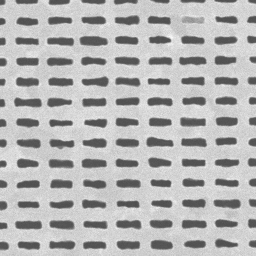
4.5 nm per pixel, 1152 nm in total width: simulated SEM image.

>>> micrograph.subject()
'a regular array of holes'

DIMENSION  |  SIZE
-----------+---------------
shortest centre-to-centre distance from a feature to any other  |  90.9 nanometres